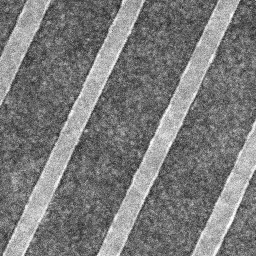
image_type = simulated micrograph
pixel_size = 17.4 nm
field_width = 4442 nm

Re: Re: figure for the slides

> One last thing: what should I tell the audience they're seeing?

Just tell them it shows one or a few lines or trenches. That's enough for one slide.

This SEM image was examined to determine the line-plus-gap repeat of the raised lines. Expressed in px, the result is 85.8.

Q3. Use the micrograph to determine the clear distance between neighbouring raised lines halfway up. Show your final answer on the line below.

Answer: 1.17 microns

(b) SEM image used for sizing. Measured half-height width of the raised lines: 331 nm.